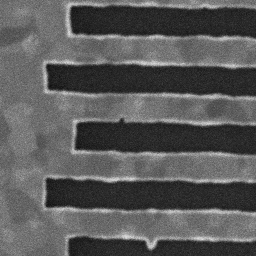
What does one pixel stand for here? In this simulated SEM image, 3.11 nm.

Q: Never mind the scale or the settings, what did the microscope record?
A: parallel lines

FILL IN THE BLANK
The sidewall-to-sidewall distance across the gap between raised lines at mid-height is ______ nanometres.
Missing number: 94.8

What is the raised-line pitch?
180 nanometers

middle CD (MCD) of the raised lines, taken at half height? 27.9 px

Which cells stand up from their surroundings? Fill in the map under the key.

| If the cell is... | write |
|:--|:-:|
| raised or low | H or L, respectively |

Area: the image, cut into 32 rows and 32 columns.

HHHHHHHHHHHHHHHHHHHHHHHHHHHHHHHH
HHHHHHHHHLLLLLLLLLLLLLLLLLLLLLLL
HHHHHHHHLLLLLLLLLLLLLLLLLLLLLLLL
HHHHHHHHHLLLLLLLLLLLLLLLLLLLLLLL
HHHHHHHHHHHLLLLLLLLLLLLLLHLLLLLL
HHHHHHHHHHHHHHHHHHHHHHHHHHHHHHHH
HHHHHHHHHHHHHHHHHHHHHHHHHHHHHHHH
HHHHHHHHHHHHHHHHHHHHHHHHHHHHHHHH
HHHHHHLLLLLLLLLLLLLLLLLLLLLLLLLL
HHHHHHLLLLLLLLLLLLLLLLLLLLLLLLLL
HHHHHHLLLLLLLLLLLLLLLLLLLLLLLLLL
HHHHHHHHLLLLLLLLLLLLLLLLLLLLLLLL
HHHHHHHHHHHHHHHHHHHHHHHHHHHHHHHH
HHHHHHHHHHHHHHHHHHHHHHHHHHHHHHHH
HHHHHHHHHHHHHHHHHHHHHHHHHHHHHHHH
HHHHHHHHHHLLLLLLLLLLLLLLLHHLLHHH
HHHHHHHHHHLLLLLLLLLLLLLLLLLLLLLL
HHHHHHHHHLLLLLLLLLLLLLLLLLLLLLLL
HHHHHHHHHLLLLLLLLLLLLLLLLLLLLLLL
HHHHHHHHHHHHHHHHHHHHHHHHHHHHHHHH
HHHHHHHHHHHHHHHHHHHHHHHHHHHHHHHH
HHHHHHHHHHHHHHHHHHHHHHHHHHHHHHHH
HHHHHHLLLLLLLLHHLHLHHLLHHHHHHHHH
HHHHHHLLLLLLLLLLLLLLLLLLLLLLLLLL
HHHHHHLLLLLLLLLLLLLLLLLLLLLLLLLL
HHHHHHLLLLLLLLLLLLLLLLLLLLLLLLLL
HHHHHHHHHHHHHHHHHHHHHHHHHHHHHHLL
HHHHHHHHHHHHHHHHHHHHHHHHHHHHHHHH
HHHHHHHHHHHHHHHHHHHHHHHHHHHHHHHH
HHHHHHHHHLLHHHHHHHHHHHHHHHHHHHHH
HHHHHHHHLLLLLLLLLLLLLLLLLLLLLLLL
HHHHHHHHLLLLLLLLLLLLLLLLLLLLLLLL